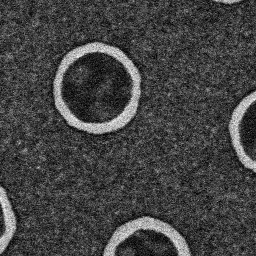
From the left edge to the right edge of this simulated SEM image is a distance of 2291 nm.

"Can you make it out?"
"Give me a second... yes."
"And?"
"raised bodies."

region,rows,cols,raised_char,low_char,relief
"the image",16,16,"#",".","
................
................
................
....####........
....####........
....#####.......
....####.......#
....####.......#
...............#
...............#
................
................
................
#...............
#.......###.....
.......####.....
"